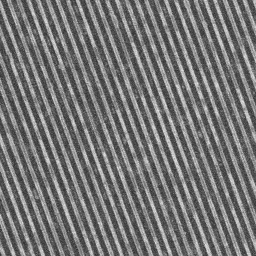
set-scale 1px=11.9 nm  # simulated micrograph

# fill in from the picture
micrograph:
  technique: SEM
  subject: parallel lines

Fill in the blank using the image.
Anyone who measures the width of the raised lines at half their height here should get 33.5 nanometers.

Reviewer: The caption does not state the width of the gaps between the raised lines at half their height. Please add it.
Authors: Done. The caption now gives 75.4 nanometres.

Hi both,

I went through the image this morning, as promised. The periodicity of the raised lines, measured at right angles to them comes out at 110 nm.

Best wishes